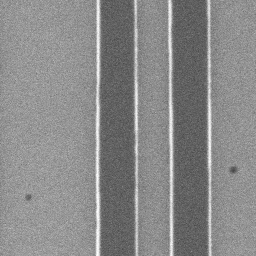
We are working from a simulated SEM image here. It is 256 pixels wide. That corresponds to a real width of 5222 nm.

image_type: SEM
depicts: lines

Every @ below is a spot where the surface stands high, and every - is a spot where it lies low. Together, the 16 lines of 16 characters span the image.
------@@---@@---
------@@---@@---
------@@---@@---
------@@---@@---
------@@---@@---
------@@@--@@---
------@@@--@@---
------@@@--@@---
------@@@--@@---
------@@@--@@---
------@@@--@@---
------@@@--@@---
------@@@--@@---
------@@@--@@---
------@@@--@@---
------@@@--@@---